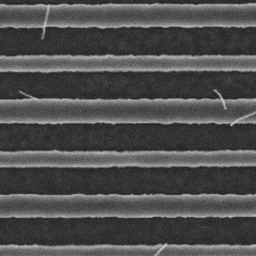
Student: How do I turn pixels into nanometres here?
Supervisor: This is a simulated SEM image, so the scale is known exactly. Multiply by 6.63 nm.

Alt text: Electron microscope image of lines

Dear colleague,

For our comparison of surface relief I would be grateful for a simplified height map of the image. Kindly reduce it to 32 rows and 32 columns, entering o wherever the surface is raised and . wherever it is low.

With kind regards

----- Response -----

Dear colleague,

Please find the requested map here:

...................o...........o
oooooooooooooooooooooooooooooooo
oooooooooooooooooooooooooooooooo
..oo.o......ooo.................
................................
................................
................................
oooooooooooooooooooooooooooooooo
oooooooooooooooooooooooooooooooo
................................
................................
................................
..ooooooooo.o.oooooooooooooo.ooo
oooooooooooooooooooooooooooooooo
oooooooooooooooooooooooooooooooo
................................
................................
................................
................................
oooooooooooooooooooooooooooooooo
oooooooooooooooooooooooooooooooo
................................
................................
................................
oooooooooooooooooooooooooooooooo
oooooooooooooooooooooooooooooooo
oooooooooooooooooooooooooooooooo
................................
................................
................................
................................
oooooooooooooooooooooooooooooooo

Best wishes